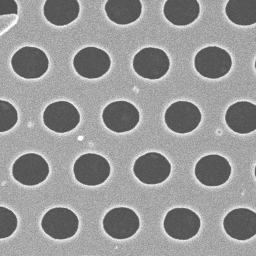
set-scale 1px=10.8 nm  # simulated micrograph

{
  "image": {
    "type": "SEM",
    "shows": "a regular array of holes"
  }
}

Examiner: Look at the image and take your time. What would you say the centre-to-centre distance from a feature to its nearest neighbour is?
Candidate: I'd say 653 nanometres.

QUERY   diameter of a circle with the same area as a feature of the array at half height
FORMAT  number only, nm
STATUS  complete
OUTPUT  372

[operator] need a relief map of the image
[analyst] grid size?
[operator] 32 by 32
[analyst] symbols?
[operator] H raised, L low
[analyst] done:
LLHHHHLLLLHHHLLLLLHHHLLLLHHHLLLL
LLHHHHLLLLHHHLLLLLHHLLLLLHHHLLLL
HHHHHHLLLHHHHHLLLHHHHLLLHHHHHLLL
HHHHHHHHHHHHHHHHHHHHHHHHHHHHHHHH
HHHHHHHHHHHHHHHHHHHHHHHHHHHHHHHH
HHHHHHHHHHHHHHHHHHHHHHHHHHHHHHHH
HHLLLHHHHHLLLHHHHLLLLHHHHLLLHHHH
HLLLLLHHHLLLLLHHHLLLLHHHLLLLLHHH
HHLLLLHHHLLLLLHHHLLLLHHHLLLLLHHH
HHLLLHHHHHLLLHHHHHLLHHHHHLLLHHHH
HHHHHHHHHHHHHHHHHHHHHHHHHHHHHHHH
HHHHHHHHHHHHHHHHHHHHHHHHHHHHHHHH
HHHHHHHHHHHHHHHHHHHHHHHHHHHHHHHH
LLHHHHLLLHHHHLLLLHHHHLLLLHHHHLLL
LLHHHLLLLLHHHLLLLHHHHLLLLHHHLLLL
LLHHHHLLLLHHHLLLLHHHHLLLLHHHLLLL
HHHHHHHLHHHHHHLHHHHHHHLLHHHHHHLH
HHHHHHHHHHHHHHHHHHHHHHHHHHHHHHHH
HHHHHHHHHHHHHHHHHHHHHHHHHHHHHHHH
HHHLLHHHHHLLLHHHHHLLHHHHHHLLHHHH
HHLLLLHHHLLLLLHHHLLLLHHHHLLLLHHH
HHLLLLHHHLLLLLHHHLLLLHHHLLLLLHHH
HHLLLLHHHHLLLHHHHLLLLHHHHLLLHHHH
HHHHHHHHHHHHHHHHHHHHHHHHHHHHHHHH
HHHHHHHHHHHHHHHHHHHHHHHHHHHHHHHH
HHHHHHHHHHHHHHHHHHHHHHHHHHHHHHHH
LLHHHHLLLHHHHHLLLHHHHLLLHHHHHLLL
LLHHHLLLLLHHHLLLLHHHHLLLLHHHLLLL
LLHHHLLLLLHHHLLLLHHHHLLLLHHHLLLL
LHHHHHLLLHHHHHLLHHHHHLLLHHHHHLLL
HHHHHHHHHHHHHHHHHHHHHHHHHHHHHHHH
HHHHHHHHHHHHHHHHHHHHHHHHHHHHHHHH